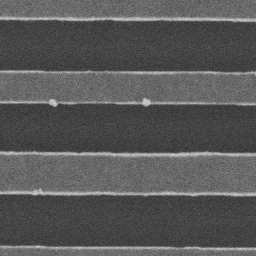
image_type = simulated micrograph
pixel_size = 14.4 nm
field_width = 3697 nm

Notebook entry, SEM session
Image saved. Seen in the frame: lines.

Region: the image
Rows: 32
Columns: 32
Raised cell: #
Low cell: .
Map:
################################
################################
........####..##################
................................
................................
................................
................................
................................
................................
################################
################################
################################
################################
................................
................................
................................
................................
................................
................................
################################
################################
################################
################################
################################
................................
................................
................................
................................
................................
................................
................................
################################